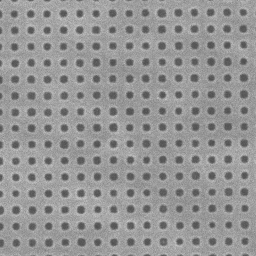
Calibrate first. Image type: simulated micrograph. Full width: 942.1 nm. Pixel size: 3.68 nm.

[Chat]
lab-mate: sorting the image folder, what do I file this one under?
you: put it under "a regular array of holes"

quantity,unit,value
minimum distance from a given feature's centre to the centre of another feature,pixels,16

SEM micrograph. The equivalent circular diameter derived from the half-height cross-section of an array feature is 0.0319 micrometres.